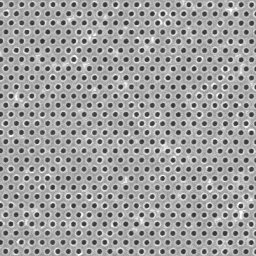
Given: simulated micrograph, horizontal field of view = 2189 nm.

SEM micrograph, a regular array of holes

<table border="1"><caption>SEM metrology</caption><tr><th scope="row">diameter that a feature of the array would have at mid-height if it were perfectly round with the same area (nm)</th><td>44.2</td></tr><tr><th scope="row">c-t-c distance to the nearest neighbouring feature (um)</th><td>0.0875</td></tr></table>